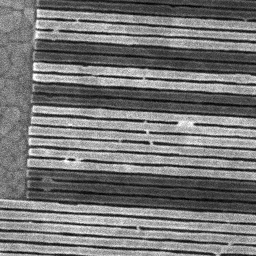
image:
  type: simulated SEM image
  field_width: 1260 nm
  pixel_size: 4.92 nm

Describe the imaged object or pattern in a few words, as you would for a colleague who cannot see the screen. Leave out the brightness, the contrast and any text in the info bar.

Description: parallel lines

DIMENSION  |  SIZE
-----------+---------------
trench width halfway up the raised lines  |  0.0147 µm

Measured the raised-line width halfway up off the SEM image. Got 34.4 nanometres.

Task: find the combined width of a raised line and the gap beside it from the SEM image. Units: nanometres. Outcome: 52.6